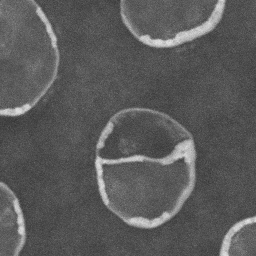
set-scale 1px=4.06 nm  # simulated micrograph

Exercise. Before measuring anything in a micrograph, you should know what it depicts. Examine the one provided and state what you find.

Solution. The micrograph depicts raised bodies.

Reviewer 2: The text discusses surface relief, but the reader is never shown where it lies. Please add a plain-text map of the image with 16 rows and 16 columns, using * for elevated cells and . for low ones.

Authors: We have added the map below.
**......******..
***.....*****...
***......***....
****............
****............
***.............
**..............
................
................
...........*....
......******....
......******....
*.....*****.....
*......****.....
**............**
*.............**